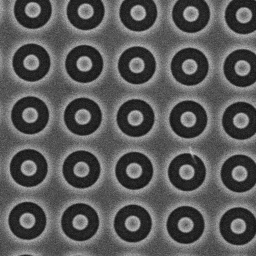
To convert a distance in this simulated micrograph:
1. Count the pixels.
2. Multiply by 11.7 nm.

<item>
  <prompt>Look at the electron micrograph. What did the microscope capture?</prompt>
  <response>an array of small figures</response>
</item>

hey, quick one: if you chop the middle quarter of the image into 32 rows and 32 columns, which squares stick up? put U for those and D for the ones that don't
DDDUUUUDDDUUUDDDUUUUDDDUUUUDDDUU
DDDDUUDDDDUUUUDDDUUUDDDUUUUDDDUU
UDDDDDDDDUUUUUDDDDDDDDDUUUUDDDDD
UUDDDDDDUUUUUUUDDDDDDDUUUUUDDDDD
UUUUDDDUUUUUUUUUDDDDDUUUUUUUUDDD
UUUUUUUUUUUUUUUUUUUUUUUUUUUUUUUD
UUUUUUUUUUUUUUUUUUUUUUUUUUUUUUUU
UUUUUUUUUUUUUUUUUUUUUUUUUUUUUUUU
UUUDDDUUUUUUUUUUUUUUUUUUUUUUUUUU
UUDDDDDDUUUUUUUDDDDDUUUUUUUUUDDD
UDDDDDDDDUUUUUDDDDDDDDUUUUUUDDDD
DDDDDDDDDUUUUDDDDDDDDDUUUUUDDDDD
DDDUUUDDDUUUUDDDUUUDDDDUUUUDDDUU
DDDUUUUDDDUUUDDDUUUUDDDUUUDDDUUU
DDDUUUDDDUUUUDDDUUUDDDUUUUDDDDUU
UDDDDDDDDUUUUDDDDDDDDDUUUUDDDDUU
UDDDDDDDUUUUUUDDDDDDDDUUUUUDDDDD
UUDDDDDUUUUUUUUDDDDDDUUUUUUUDDDD
UUUUUUUUUUUUUUUUUUUUUUUUUUUUUUDD
UUUUUUUUUUUUUUUUUUUUUUUUUUUUUUUU
UUUUUUUUUUUUUUUUUUUUUUUUUUUUUUUU
UUUUUUUUUUUUUUUUUUUUUUUUUUUUUUUU
UDDDDDDUUUUUUUUDDDDDUUUUUUUUUDDD
UDDDDDDDUUUUUUDDDDDDDUUUUUUDDDDD
DDDDDDDDDUUUUDDDDDDDDDUUUUUDDDDD
DDDUUUDDDUUUUDDDUUUDDDUUUUDDDDUU
DDDUUUDDDUUUUDDDUUUDDDUUUUDDDUUU
DDDUUUDDDUUUUDDDUUUDDDUUUUDDDUUU
DDDDDDDDDUUUUDDDDDDDDDUUUUDDDDUU
UDDDDDDDUUUUUUDDDDDDDUUUUUUDDDDD
UUDDDDDUUUUUUUUDDDDDDUUUUUUDDDDD
UUUUUUUUUUUUUUUUUDUUUUUUUUUUUDDD